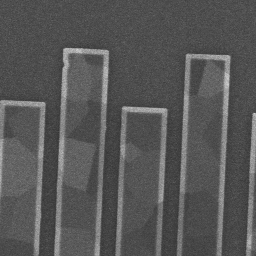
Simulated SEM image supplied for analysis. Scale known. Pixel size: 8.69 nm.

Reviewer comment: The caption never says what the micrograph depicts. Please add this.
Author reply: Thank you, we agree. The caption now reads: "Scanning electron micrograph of one or a few lines or trenches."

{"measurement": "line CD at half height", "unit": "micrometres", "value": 0.358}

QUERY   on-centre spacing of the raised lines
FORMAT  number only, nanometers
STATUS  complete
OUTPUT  530